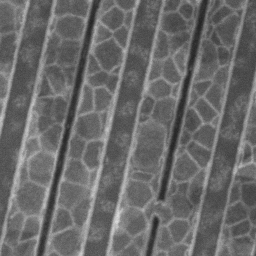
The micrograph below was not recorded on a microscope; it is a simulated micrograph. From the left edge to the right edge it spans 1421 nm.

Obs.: parallel lines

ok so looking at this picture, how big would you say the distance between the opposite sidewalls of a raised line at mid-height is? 0.204 micrometres